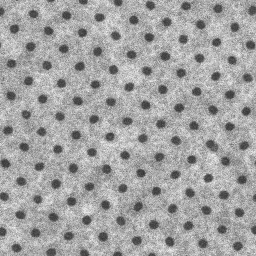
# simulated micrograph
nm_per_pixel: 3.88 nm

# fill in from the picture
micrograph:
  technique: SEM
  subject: a regular array of holes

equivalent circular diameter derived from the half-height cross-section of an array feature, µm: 0.0366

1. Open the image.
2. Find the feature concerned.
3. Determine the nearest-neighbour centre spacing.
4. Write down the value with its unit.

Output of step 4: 90.2 nm